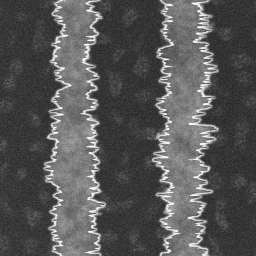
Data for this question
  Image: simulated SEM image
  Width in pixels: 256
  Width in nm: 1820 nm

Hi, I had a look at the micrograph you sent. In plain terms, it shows one or a few lines or trenches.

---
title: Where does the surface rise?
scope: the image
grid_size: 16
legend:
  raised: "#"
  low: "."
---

####..####..####
####..####...###
####..#####..###
###..#####...###
####..####...###
####..####...###
####..####...###
###...####..####
###...####...###
###...####...###
###...####...###
###...#####..###
####..####..####
###...####..####
###...#####..###
####..####...###